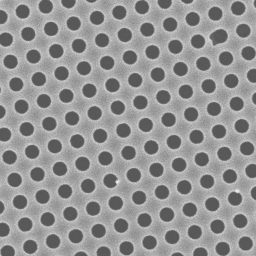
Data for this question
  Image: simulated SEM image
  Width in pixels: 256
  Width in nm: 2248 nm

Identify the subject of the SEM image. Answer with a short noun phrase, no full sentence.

a regular array of holes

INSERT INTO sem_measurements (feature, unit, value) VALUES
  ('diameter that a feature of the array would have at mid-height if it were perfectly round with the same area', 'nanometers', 127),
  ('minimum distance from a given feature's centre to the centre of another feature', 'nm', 202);